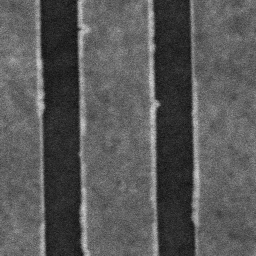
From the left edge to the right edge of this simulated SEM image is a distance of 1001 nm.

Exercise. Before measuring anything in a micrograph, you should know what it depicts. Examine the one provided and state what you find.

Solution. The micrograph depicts one or a few lines or trenches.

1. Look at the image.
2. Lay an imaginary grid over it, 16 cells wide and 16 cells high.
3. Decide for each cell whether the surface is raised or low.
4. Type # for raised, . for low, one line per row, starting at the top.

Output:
##...#####..####
##...#####..####
##...#####..####
###..#####..####
###..#####..####
###..#####..####
###..#####..####
###..#####..####
###..#####..####
###..#####..####
###..#####..####
###..#####..####
###..#####..####
###..#####..####
###..#####..####
###..#####..####